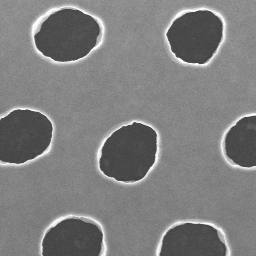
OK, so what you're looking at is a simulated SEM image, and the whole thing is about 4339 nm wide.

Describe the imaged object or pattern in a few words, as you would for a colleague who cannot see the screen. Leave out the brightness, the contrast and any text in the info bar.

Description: holes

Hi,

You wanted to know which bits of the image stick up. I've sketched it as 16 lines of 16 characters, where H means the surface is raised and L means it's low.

HHHHHHHHHHHHHHHH
HHHLLLHHHHHLLLHH
HHLLLLHHHHHLLLHH
HHHLLHHHHHHLLHHH
HHHHHHHHHHHHHHHH
HHHHHHHHHHHHHHHH
HHHHHHHHHHHHHHHH
LLLHHHHHHHHHHHHL
LLLHHHHLLLHHHHLL
LLLHHHLLLLHHHHLL
HHHHHHLLLHHHHHHH
HHHHHHHHHHHHHHHH
HHHHHHHHHHHHHHHH
HHHHHHHHHHHHHHHH
HHHLLLHHHHLLLLHH
HHHLLLHHHHLLLLHH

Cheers